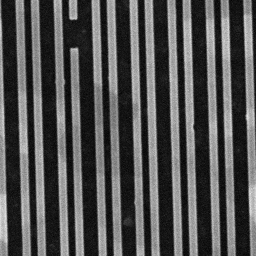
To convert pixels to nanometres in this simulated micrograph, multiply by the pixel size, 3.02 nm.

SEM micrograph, parallel lines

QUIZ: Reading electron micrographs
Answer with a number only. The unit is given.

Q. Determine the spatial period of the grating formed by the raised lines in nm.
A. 56.9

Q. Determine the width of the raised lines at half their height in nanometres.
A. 23.4